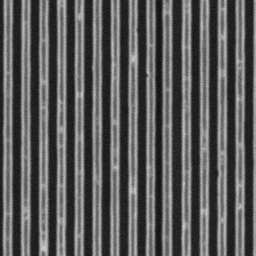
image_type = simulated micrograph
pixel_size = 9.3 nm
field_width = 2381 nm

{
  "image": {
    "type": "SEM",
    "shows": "parallel lines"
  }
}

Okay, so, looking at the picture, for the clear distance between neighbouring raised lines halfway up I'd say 101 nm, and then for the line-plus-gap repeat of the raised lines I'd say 166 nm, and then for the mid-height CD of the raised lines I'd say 63.9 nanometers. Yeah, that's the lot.